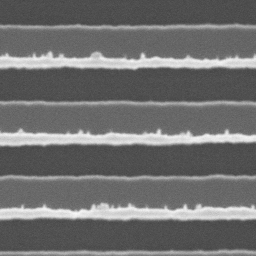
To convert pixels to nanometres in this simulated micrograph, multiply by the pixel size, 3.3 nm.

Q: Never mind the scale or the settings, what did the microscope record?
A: lines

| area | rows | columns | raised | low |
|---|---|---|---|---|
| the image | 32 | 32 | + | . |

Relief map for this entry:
................................
................................
................................
++++++++++++++++++++++++++++++++
++++++++++++++++++++++++++++++++
++++++++++++++++++++++++++++++++
++++++++++++++++++++++++++++++++
++++++++++++++++++++++++++++++++
................+...............
................................
................................
................................
................................
++++++++++++++++++++++++++++++++
++++++++++++++++++++++++++++++++
++++++++++++++++++++++++++++++++
++++++++++++++++++++++++++++++++
++++++++++++++++++++++++++++++++
................................
................................
................................
................................
++++++++++++++++++++++++++++++++
++++++++++++++++++++++++++++++++
++++++++++++++++++++++++++++++++
++++++++++++++++++++++++++++++++
++++++++++++++++++++++++++++++++
................................
................................
................................
................................
..........+..........+..++.++++.